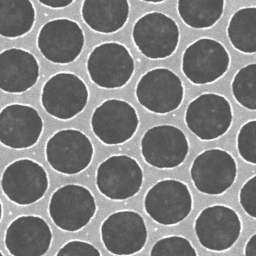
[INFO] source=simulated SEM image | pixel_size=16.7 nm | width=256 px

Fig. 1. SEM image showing a regular array of holes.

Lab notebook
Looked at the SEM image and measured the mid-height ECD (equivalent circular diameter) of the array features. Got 762 nanometers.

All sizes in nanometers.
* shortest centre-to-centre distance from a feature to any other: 907